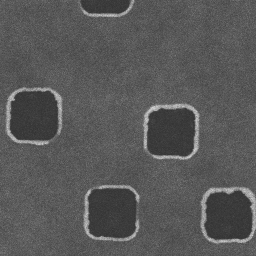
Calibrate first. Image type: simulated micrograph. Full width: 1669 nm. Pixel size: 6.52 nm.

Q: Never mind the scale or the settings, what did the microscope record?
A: holes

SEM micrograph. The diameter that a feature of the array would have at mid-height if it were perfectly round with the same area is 339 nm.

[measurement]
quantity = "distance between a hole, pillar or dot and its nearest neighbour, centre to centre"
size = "101 px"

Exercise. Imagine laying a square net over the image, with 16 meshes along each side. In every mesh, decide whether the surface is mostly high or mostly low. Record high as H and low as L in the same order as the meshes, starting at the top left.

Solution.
HHHHHLLLHHHHHHHH
HHHHHHHHHHHHHHHH
HHHHHHHHHHHHHHHH
HHHHHHHHHHHHHHHH
HHHHHHHHHHHHHHHH
HHHHHHHHHHHHHHHH
HLLLHHHHHHHHHHHH
HLLLHHHHHLLLHHHH
HLLHHHHHHLLLHHHH
HHHHHHHHHHLLHHHH
HHHHHHHHHHHHHHHH
HHHHHHHHHHHHHHHH
HHHHHHLLLHHHHLLL
HHHHHHLLHHHHHLLL
HHHHHHLLHHHHHLLL
HHHHHHHHHHHHHHHH